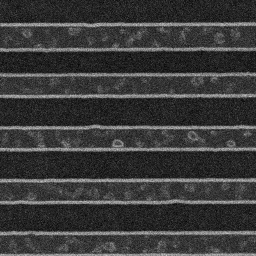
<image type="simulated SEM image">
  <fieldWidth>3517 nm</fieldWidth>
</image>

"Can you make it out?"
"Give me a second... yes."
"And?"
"parallel lines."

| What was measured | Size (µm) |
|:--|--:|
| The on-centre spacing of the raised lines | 0.707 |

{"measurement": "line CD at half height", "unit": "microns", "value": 0.314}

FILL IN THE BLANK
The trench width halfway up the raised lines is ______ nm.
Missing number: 407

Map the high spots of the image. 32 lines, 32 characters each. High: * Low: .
................................
................................
................................
********************************
********************************
********************************
................................
................................
................................
********************************
********************************
********************************
................................
................................
................................
................................
********************************
********************************
********************************
................................
................................
................................
............................****
********************************
********************************
................................
................................
................................
................................
********************************
********************************
********************************